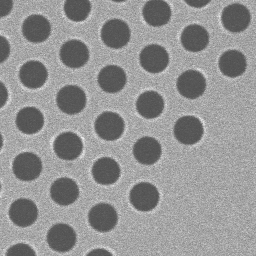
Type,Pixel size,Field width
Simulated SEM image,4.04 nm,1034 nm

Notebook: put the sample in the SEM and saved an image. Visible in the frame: a regular array of holes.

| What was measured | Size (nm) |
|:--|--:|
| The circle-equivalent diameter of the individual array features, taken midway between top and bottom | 117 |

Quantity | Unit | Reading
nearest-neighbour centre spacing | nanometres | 184